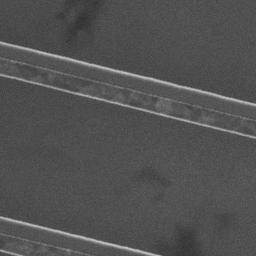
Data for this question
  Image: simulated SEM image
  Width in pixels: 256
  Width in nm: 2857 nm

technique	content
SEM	lines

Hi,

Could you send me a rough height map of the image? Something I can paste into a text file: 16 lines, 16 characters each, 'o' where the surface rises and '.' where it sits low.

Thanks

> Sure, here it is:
................
................
................
oooo............
oooooooo........
...ooooooooo....
........oooooooo
............oooo
................
................
................
................
................
................
oooo............
oooooooo........